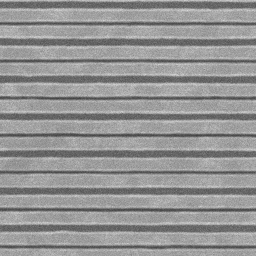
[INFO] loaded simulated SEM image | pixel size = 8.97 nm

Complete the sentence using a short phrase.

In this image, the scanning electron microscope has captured parallel lines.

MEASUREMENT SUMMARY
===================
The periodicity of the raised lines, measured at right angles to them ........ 167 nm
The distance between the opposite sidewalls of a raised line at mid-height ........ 114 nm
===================